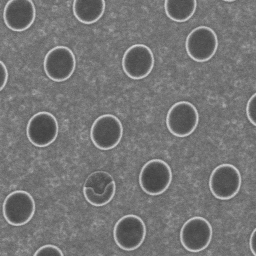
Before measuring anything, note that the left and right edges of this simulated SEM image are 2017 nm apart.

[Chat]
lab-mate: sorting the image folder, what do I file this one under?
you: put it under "a regular array of raised bodies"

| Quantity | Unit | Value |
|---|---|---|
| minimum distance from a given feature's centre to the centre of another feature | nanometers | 504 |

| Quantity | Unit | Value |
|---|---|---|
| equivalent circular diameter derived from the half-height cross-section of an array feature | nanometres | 253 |